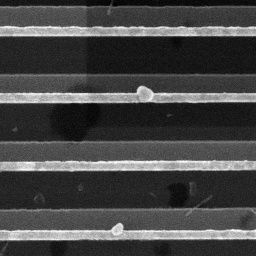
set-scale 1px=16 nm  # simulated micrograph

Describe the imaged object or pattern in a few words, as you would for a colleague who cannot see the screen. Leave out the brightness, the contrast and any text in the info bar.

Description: lines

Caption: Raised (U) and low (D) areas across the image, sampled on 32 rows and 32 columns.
DDDDDDDDDDDDDDDDDDDDDDDDDDDDDDDD
UUUUUUUUUUUUUUUUUUUUUUUUUUUUUUUU
UUUUUUUUUUUUUUUUUUUUUUUUUUUUUUUU
UUUUUUUUUUUUUUUUUUUUUUUUUUUUUUUU
DDDDDDDDDDDDDDDDDDDDDDDDDDDDDDDD
DDDDDDDDDDDDDDDDDDDDDDDDDDDDDDDD
DDDDDDDDDDDDDDDDDDDDDDDDDDDDDDDD
DDDDDDDDDDDDDDDDDDDDDDDDDDDDDDDD
DDDDDDDDDDDDDDDDDDDDDDDDDDDDDDDD
UUUUUUUUUUUUUUUUUUUUUUUUUUUUUUUU
UUUUUUUUUUUUUUUUUUUUUUUUUUUUUUUU
UUUUUUUUUUUUUUUUUUUUUUUUUUUUUUUU
UUUUUUUUUUUUUUUUUUUUUUUUUUUUUUUU
DDDDDDDDDDDDDDDDDDDDDDDDDDDDDDDD
DDDDDDDDDDDDDDDDDDDDDDDDDDDDDDDD
DDDDDDDDDDDDDDDDDDDDDDDDDDDDDDDD
DDDDDDDDDDDDDDDDDDDDDDDDDDDDDDDD
DDDDDDDDDDDDDDDDDDDDDDDDDDDDDDDD
UUUUUUUUUUUUUUUUUUUUUUUUUUUUUUUU
UUUUUUUUUUUUUUUUUUUUUUUUUUUUUUUU
UUUUUUUUUUUUUUUUUUUUUUUUUUUUUUUU
DDDDDDDDDDDDDDDDDDDDDDDDDDDDDDDD
DDDDDDDDDDDDDDDDDDDDDDDDDDDDDDDD
DDDDDDDDDDDDDDDDDDDDDDDDDDDDDDDD
DDDDDDDDDDDDDDDDDDDDDDDDDDDDDDDD
DDDDDDDDDDDDDDDDDDDDDDDDDDDDDDDD
UUUUUUUUUUUUUUUUUUUUUUUUUUUUUUUU
UUUUUUUUUUUUUUUUUUUUUUUUUUUUUUUU
UUUUUUUUUUUUUUUUUUUUUUUUUUUUUUUU
UUUUUUUUUUUUUUUUUUUUUUUUUUUUUUUU
DDDDDDDDDDDDDDDDDDDDDDDDDDDDDDDD
DDDDDDDDDDDDDDDDDDDDDDDDDDDDDDDD